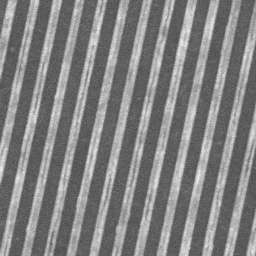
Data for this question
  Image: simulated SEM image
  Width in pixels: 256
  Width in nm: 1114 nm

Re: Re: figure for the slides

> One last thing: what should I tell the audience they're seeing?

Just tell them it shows parallel lines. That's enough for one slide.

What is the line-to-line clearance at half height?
59.6 nm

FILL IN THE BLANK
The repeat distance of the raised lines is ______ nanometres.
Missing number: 95.5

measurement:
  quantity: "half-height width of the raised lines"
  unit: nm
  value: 37.2